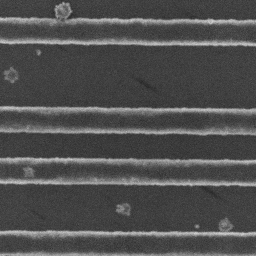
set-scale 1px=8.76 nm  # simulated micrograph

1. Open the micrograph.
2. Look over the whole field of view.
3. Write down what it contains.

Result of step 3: lines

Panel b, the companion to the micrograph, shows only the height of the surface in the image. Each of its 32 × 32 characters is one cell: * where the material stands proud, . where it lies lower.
................................
.......**.......................
*****..****..**.**........*.....
********************************
********************************
..............................**
................................
................................
................................
................................
................................
................................
................................
................................
********************************
********************************
..............**.***************
................................
................................
................................
********************************
********************************
********************************
................................
................................
................................
................................
................................
................................
********************************
********************************
********************************